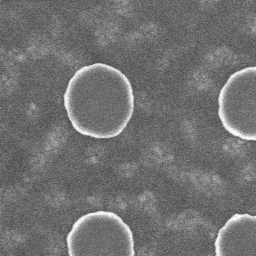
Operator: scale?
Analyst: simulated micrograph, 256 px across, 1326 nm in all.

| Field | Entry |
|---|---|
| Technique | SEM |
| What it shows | raised bodies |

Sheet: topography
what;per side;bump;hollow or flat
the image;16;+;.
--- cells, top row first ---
................
................
................
................
.....++........+
....++++......++
....++++......++
....++++......++
......+........+
................
................
................
................
.....++........+
....++++......++
....++++......++